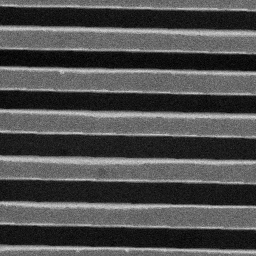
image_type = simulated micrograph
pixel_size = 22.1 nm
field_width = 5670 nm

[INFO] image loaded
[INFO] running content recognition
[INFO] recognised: lines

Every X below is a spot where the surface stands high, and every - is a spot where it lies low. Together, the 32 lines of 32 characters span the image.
XXXXXXXXXXXXXXXXXXXXXXXXXXXXXXXX
--------------------------------
--------------------------------
XXXXXXXXXXXX--------------------
XXXXXXXXXXXXXXXXXXXXXXXXXXXXXXXX
XXXXXXXXXXXXXXXXXXXXXXXXXXXXXXXX
--------------------XXXXXXXXXXXX
--------------------------------
XXXXXX--------------------------
XXXXXXXXXXXXXXXXXXXXXXXXXXXXXXXX
XXXXXXXXXXXXXXXXXXXXXXXXXXXXXXXX
----------------XXXXXXXXXXXXXXXX
--------------------------------
--------------------------------
XXXXXXXXXXXXXXXXXXXXXXXXXXXXXXXX
XXXXXXXXXXXXXXXXXXXXXXXXXXXXXXXX
XXXXXXXXXXXXXXXXXXXXXXXXXXXXXXXX
--------------------------------
--------------------------------
--------------------------------
XXXXXXXXXXXXXXXXXXXXXXXXXXXXXXXX
XXXXXXXXXXXXXXXXXXXXXXXXXXXXXXXX
---------XXXXXXXXXXXXXXXXXXXXXXX
--------------------------------
--------------------------------
XXXXXXXXXXXX--------------------
XXXXXXXXXXXXXXXXXXXXXXXXXXXXXXXX
XXXXXXXXXXXXXXXXXXXXXXXXXXXXXXXX
-------------------------XXXXXXX
--------------------------------
--------------------------------
XXXXXXXXXXXXXXXXXXXXXXXXXXXXXXXX